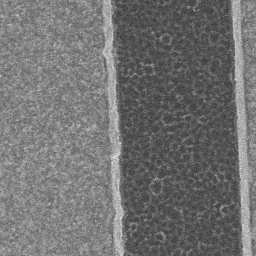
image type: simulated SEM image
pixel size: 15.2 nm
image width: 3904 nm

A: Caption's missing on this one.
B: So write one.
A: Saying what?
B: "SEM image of one or a few lines or trenches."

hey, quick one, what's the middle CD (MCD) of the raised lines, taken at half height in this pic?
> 1.94 microns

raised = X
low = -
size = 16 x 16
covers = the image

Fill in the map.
-------XXXXXXXX-
-------XXXXXXXX-
-------XXXXXXXX-
-------XXXXXXXX-
-------XXXXXXXX-
-------XXXXXXXX-
-------XXXXXXXX-
-------XXXXXXXX-
-------XXXXXXXX-
-------XXXXXXXX-
-------XXXXXXXX-
-------XXXXXXXX-
-------XXXXXXXX-
-------XXXXXXXX-
-------XXXXXXXX-
-------XXXXXXXX-